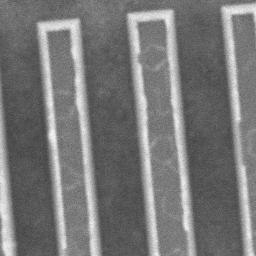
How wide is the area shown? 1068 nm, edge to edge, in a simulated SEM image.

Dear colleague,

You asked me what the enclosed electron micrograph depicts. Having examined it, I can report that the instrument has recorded one or a few lines or trenches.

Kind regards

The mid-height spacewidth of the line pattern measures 0.219 microns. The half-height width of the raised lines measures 169 nanometres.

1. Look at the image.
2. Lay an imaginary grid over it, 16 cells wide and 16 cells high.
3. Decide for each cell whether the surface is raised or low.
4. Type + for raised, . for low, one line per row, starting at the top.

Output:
...............+
...++...+++...++
...++...+++...++
...++...+++...++
...++...+++...++
...++...+++...++
...++....++....+
...++....++....+
...++....++....+
...+++...+++...+
...+++...+++...+
...+++...+++...+
+..+++...+++...+
+...++...+++...+
+...++...+++...+
+...++...+++...+